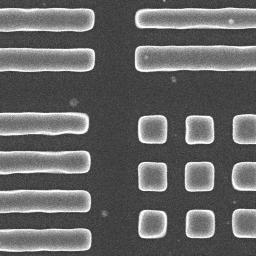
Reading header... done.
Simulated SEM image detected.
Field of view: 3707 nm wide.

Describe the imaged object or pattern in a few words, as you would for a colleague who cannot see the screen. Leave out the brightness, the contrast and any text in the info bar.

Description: groups of lines, slits or small figures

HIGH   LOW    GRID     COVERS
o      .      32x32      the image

................................
oooooooooooo.....ooooooooooooooo
oooooooooooo.....ooooooooooooooo
ooooooooooo...........o.....ooo.
................................
................................
oooooooooooo.....ooooooooooooooo
oooooooooooo.....ooooooooooooooo
ooooooooooo......ooooooooooooooo
................................
................................
................................
................................
................................
ooooooooooo.......oo....o.....oo
ooooooooooo......oooo..oooo..ooo
oooooooooo.......oooo..oooo..ooo
..................ooo..oooo..ooo
................................
ooooooooooo.....................
ooooooooooo.......oo....oo....oo
ooo.....ooo......oooo..oooo..ooo
.................oooo..oooo..ooo
..................ooo..oooo...oo
ooooooooooo.....................
ooooooooooo.....................
o.................oo....oo...ooo
.................oooo..oooo..ooo
.................oooo..oooo..ooo
ooooooooooo.......oo....oo....oo
ooooooooooo.....................
................................